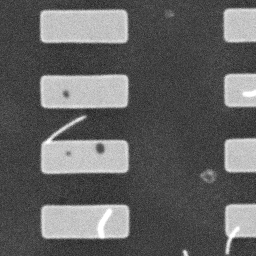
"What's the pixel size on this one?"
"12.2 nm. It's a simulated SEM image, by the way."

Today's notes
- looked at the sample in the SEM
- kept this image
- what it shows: groups of lines, slits or small figures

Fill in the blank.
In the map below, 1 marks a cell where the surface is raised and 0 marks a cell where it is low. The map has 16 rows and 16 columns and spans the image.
0000000000000000
0001111100000011
0001111100000011
0000000000000000
0000000000000000
0001111100000011
0001111100000011
0000000000000000
0000000000000000
0001111100000011
0001111100000011
0000000000000000
0000000000000000
0001111100000011
0001111100000011
0000000000000000